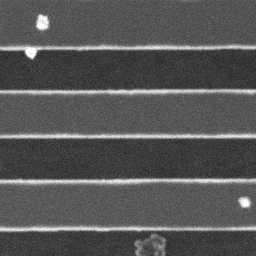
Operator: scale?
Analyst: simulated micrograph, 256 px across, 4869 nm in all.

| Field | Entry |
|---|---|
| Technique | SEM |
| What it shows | lines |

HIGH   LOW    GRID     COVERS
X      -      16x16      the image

XXXXXXXXXXXXXXXX
XXXXXXXXXXXXXXXX
XXXXXXXXXXXXXXXX
----------------
----------------
----------------
XXXXXXXXXXXXXXXX
XXXXXXXXXXXXXXXX
XXXXXXXXXXXXXXXX
----------------
----------------
XXXXXXXXXXXXXXXX
XXXXXXXXXXXXXXXX
XXXXXXXXXXXXXXXX
----------------
----------------